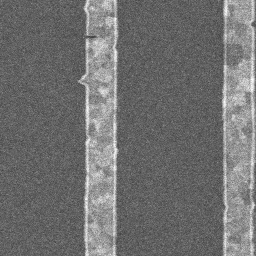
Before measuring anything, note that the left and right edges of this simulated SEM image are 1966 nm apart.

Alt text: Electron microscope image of one or a few lines or trenches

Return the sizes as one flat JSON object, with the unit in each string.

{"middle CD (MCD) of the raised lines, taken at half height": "0.207 µm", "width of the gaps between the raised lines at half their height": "0.851 µm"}